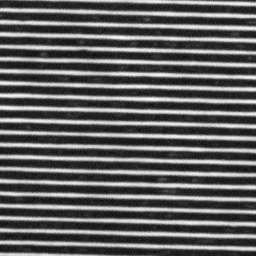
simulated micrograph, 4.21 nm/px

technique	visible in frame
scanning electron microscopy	parallel lines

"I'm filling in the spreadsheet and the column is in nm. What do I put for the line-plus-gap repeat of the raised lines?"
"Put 51.5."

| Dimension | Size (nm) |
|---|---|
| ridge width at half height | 15.2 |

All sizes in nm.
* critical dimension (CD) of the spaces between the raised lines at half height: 38.4